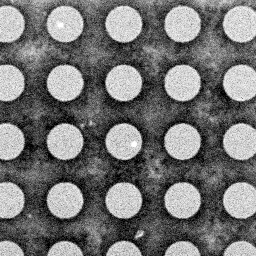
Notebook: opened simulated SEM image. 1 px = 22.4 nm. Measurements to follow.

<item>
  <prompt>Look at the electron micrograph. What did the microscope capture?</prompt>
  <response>an array of small figures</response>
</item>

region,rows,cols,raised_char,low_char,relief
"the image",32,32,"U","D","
DDDDDDDDDDDDDDDDDDDDDDDDDDDDDDDD
UUDDDDDUUUDDDDUUUDDDDUUUDDDDDUUU
UUUDDDUUUUDDDUUUUUDDDUUUUDDDUUUU
UUUDDDUUUUDDDUUUUUDDDUUUUDDDUUUU
UUDDDDDUUUDDDDUUUDDDDUUUDDDDDUUU
DDDDDDDDDDDDDDDDDDDDDDDDDDDDDDDD
DDDDDDDDDDDDDDDDDDDDDDDDDDDDDDDD
DDDDDDDDDDDDDDDDDDDDDDDDDDDDDDDD
UUDDDDDUUDDDDDUUUDDDDDUUDDDDDUUD
UUUDDDUUUUDDDDUUUDDDDUUUUDDDUUUU
UUUDDDUUUUDDDUUUUUDDDUUUUDDDUUUU
UUUDDDUUUUDDDDUUUDDDDUUUUDDDUUUU
UDDDDDDDUDDDDDDUDDDDDDUDDDDDDDUD
DDDDDDDDDDDDDDDDDDDDDDDDDDDDDDDD
DDDDDDDDDDDDDDDDDDDDDDDDDDDDDDDD
DDDDDDDDDDDDDDDDDDDDDDDDDDDDDDDD
UUUDDDUUUUDDDDUUUDDDDUUUUDDDUUUU
UUUDDDUUUUDDDUUUUUDDDUUUUDDDUUUU
UUUDDDUUUUDDDUUUUDDDDUUUUDDDUUUU
UUDDDDDUUDDDDDUUUDDDDDUUDDDDDUUD
DDDDDDDDDDDDDDDDDDDDDDDDDDDDDDDD
DDDDDDDDDDDDDDDDDDDDDDDDDDDDDDDD
DDDDDDDDDDDDDDDDDDDDDDDDDDDDDDDD
UUDDDDDUUUDDDDUUUDDDDUUUDDDDDUUU
UUUDDDUUUUDDDUUUUUDDDUUUUDDDUUUU
UUUDDDUUUUDDDUUUUUDDDUUUUDDDUUUU
UUDDDDUUUUDDDDUUUDDDDUUUDDDDDUUU
DDDDDDDDDDDDDDDDDDDDDDDDDDDDDDDD
DDDDDDDDDDDDDDDDDDDDDDDDDDDDDDDD
DDDDDDDDDDDDDDDDDDDDDDDDDDDDDDDD
UUDDDDDUUDDDDDUUUDDDDDUUDDDDDUUD
UUUDDDUUUUDDDDUUUDDDDUUUUDDDUUUU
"